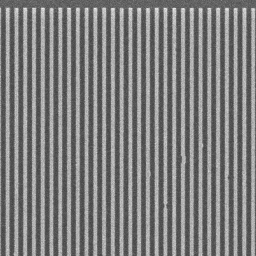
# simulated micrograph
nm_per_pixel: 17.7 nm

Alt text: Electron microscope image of parallel lines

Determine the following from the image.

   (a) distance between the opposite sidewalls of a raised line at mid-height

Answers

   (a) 61.8 nanometers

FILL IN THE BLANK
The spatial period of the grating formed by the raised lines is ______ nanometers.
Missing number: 155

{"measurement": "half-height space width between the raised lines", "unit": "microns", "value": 0.0927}